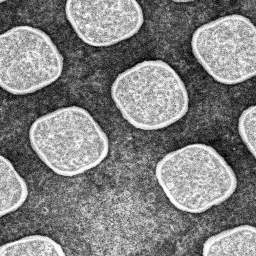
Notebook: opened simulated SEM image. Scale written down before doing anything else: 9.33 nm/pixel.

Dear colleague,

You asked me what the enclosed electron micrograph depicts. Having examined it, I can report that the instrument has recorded raised bodies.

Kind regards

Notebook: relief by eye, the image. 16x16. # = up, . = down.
....#####.......
....#####....###
###..##.....####
####........####
####....###..###
##.....####.....
.......#####....
..####..###....#
..####.........#
..#####....##...
#..##.....####..
#.........#####.
#..........###..
................
..............##
####.........###